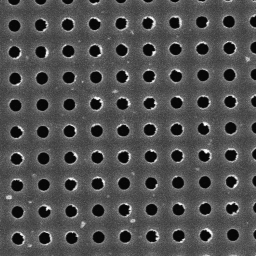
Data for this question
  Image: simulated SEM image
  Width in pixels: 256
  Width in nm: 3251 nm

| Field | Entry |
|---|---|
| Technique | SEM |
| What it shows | a regular array of holes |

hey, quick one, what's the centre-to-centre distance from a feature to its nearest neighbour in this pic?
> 335 nanometers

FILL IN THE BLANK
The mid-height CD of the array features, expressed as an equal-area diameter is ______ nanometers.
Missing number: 151